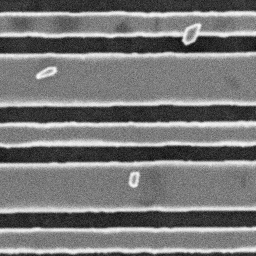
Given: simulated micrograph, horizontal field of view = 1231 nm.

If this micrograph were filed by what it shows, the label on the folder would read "lines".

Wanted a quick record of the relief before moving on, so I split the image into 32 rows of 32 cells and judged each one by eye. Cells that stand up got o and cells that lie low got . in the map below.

................................
..............o.................
oooooooooooooooooooooooooooooooo
oooooooooooooooooooooooooooooooo
o...oooooooooooo...o..ooo..oo...
................................
................................
oooooooooooooooooooooooooooooooo
oooooooooooooooooooooooooooooooo
oooooooooooooooooooooooooooooooo
oooooooooooooooooooooooooooooooo
oooooooooooooooooooooooooooooooo
oooooooooooooooooooooooooooooooo
................................
................................
..oo....oooooooooo.ooooooooooooo
oooooooooooooooooooooooooooooooo
oooooooooooooooooooooooooooooooo
................................
................................
oooooooooooooooooooooooooooooooo
oooooooooooooooooooooooooooooooo
oooooooooooooooooooooooooooooooo
oooooooooooooooooooooooooooooooo
oooooooooooooooooooooooooooooooo
oooooooooooooooooooooooooooooooo
o...............................
................................
................................
oooooooooooooooooooooooooooooooo
oooooooooooooooooooooooooooooooo
ooooooo.oo......o..o.....oo.....